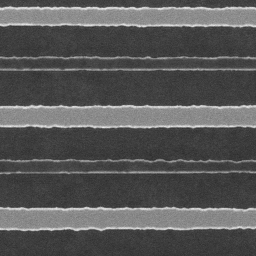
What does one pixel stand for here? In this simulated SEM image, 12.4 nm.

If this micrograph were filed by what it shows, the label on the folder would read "lines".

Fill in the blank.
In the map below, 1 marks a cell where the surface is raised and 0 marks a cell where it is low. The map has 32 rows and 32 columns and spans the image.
00000000000000000000000000000000
11111111111111111111111111111111
11111111111111111111111111111111
00000000000000000000000000000000
00000000000000000000000000000000
00000000000000000000000000000000
00000000000000000000000000000000
11111111111111111111111111111111
11111111111111111111111111111111
00000000000000000000000000000000
00000000000000000000000000000000
00000000000000000000000000000000
00000000000000000000000000000000
11111111111111111111111111111111
11111111111111111111111111111111
11111111111111111111111111111111
00000000000000000000000000000000
00000000000000000000000000000000
00000000000000000000000000000000
00000000000000000000000000000000
11111111111111111111111111111111
11111111111111111111111111111001
00000000000000000000000000000000
00000000000000000000000000000000
00000000000000000000000000000000
00000000000000000000000000000000
11111111111111111111111111111111
11111111111111111111111111111111
11111111111111111111111111111111
00000000000000000000000000000000
00000000000000000000000000000000
00000000000000000000000000000000